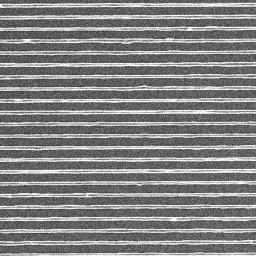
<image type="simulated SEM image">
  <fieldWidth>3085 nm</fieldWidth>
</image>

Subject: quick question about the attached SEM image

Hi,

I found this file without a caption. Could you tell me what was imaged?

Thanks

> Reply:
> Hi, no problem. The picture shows parallel lines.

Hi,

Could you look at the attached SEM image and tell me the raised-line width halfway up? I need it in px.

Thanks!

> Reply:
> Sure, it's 3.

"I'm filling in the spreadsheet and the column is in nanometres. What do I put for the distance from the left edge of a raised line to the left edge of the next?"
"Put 143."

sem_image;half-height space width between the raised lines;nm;108